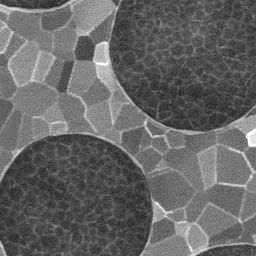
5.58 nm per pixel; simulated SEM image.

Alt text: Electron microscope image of holes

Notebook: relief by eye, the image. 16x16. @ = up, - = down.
@--@@@@---------
@@@@@@@---------
@@@@@@@---------
@@@@@@@---------
@@@@@@@---------
@@@@@@@@--------
@@@@@@@@--------
@@@@@@@@@@-----@
@@@---@@@@@@@@@@
@-------@@@@@@@@
---------@@@@@@@
---------@@@@@@@
---------@@@@@@@
----------@@@@@@
---------@@@@@@@
---------@@@@---